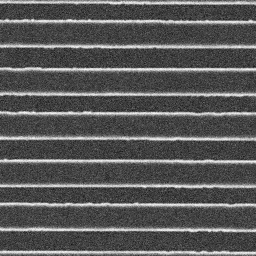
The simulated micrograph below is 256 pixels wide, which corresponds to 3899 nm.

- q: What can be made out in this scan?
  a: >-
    lines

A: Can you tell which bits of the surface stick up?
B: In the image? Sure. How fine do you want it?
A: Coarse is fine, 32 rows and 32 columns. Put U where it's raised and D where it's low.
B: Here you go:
DDDDDDDDDDDDDDDDDDDDDDDDDDDDDDDD
DDDDDDDDDDDDDDDDDDDDDDDDDDDDDDDD
DDDDDDDDDDDDDDDDDDDDDDDDDDDDDDDD
UUUUUUUUUUUUUUUUUUUUUUUUUUUUUUUU
UUUUUUUUUUUUUUUUUUUUUUUUUUUUUUUU
UUUUUUUUUUUUUUUUUUUUUUUUUUUUUUUU
DDDDDDDDDDDDDDDDDDDDDDDDDDDDDDDD
DDDDDDDDDDDDDDDDDDDDDDDDDDDDDDDD
DDDDDDDDDDDDDDDDDDDDDDDDDDDDDDDD
UUUUUUUUUUUUUUUUUUUUUUUUUUUUUUUU
UUUUUUUUUUUUUUUUUUUUUUUUUUUUUUUU
UUUUUUUUUUUUUUUUUUUUUUUUUUUUUUUU
DDDDDDDDDDDDDDDDDDDDDDDDDDDDDDDD
DDDDDDDDDDDDDDDDDDDDDDDDDDDDDDDD
UUUUUUUUUUUUUUUUUUUUUUUUUUUUUUUU
UUUUUUUUUUUUUUUUUUUUUUUUUUUUUUUU
UUUUUUUUUUUUUUUUUUUUUUUUUUUUUUUU
DDDDDDDDDDDDDDDDDDDDDDDDDDDDDDDD
DDDDDDDDDDDDDDDDDDDDDDDDDDDDDDDD
DDDDDDDDDDDDDDDDDDDDDDDDDDDDDDDD
UUUUUUUUUUUUUUUUUUUUUUUUUUUUUUUU
UUUUUUUUUUUUUUUUUUUUUUUUUUUUUUUU
UUUUUUUUUUUUUUUUUUUUUUUUUUUUUUUU
DDDDDDDDDDDDDDDDDDDDDDDDDDDDDDDD
DDDDDDDDDDDDDDDDDDDDDDDDDDDDDDDD
UUUUUUDDUDUUDUDDUUDDDDDDDDDDDDDD
UUUUUUUUUUUUUUUUUUUUUUUUUUUUUUUU
UUUUUUUUUUUUUUUUUUUUUUUUUUUUUUUU
UUUUUUUUUUUUUUUUUUUUUUUUUUUUUUUU
DDDDDDDDDDDDDDDDDDDDDDDDDDDDDDDD
DDDDDDDDDDDDDDDDDDDDDDDDDDDDDDDD
UUUUUUUUUUUUUUUUUUUUUUUUUUUUUDDD